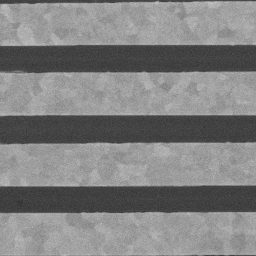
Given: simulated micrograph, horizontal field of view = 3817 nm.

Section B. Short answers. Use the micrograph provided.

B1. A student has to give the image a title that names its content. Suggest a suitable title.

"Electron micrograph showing lines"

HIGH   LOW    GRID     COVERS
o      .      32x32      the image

.ooooooooooooooooooooooooooooooo
oooooooooooooooooooooooooooooooo
oooooooooooooooooooooooooooooooo
oooooooooooooooooooooooooooooooo
oooooooooooooooooooooooooooooooo
oooooooooooooooooooooooooooooooo
................................
................................
................................
oooooooooooooooooooooooooooooooo
oooooooooooooooooooooooooooooooo
oooooooooooooooooooooooooooooooo
oooooooooooooooooooooooooooooooo
oooooooooooooooooooooooooooooooo
................................
................................
................................
................................
oooooooooooooooooooooooooooooooo
oooooooooooooooooooooooooooooooo
oooooooooooooooooooooooooooooooo
oooooooooooooooooooooooooooooooo
oooooooooooooooooooooooooooooooo
................................
................................
................................
................................
oooooooooooooooooooooooooooooooo
oooooooooooooooooooooooooooooooo
oooooooooooooooooooooooooooooooo
oooooooooooooooooooooooooooooooo
oooooooooooooooooooooooooooooooo